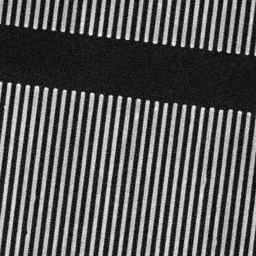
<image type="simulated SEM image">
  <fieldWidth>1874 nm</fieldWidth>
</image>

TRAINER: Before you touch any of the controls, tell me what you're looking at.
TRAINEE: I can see parallel lines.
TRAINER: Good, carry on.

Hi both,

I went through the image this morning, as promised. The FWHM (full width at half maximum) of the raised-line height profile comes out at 26.3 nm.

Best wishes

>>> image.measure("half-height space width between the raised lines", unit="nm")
41.7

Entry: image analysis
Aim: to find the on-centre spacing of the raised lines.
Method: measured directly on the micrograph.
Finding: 9.28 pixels